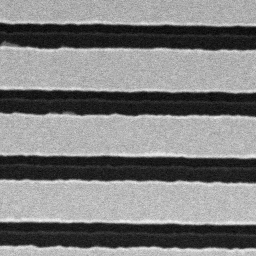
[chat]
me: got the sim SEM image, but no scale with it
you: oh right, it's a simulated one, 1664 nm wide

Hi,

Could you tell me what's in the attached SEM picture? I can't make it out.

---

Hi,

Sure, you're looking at lines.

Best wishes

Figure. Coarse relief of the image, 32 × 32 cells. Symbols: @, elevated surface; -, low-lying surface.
@@@@@@@@@@@@@@@@@@@@@@@@@@@@@@@@
@@@@@@@@@@@@@@@@@@@@@@@@@@@@@@@@
@@@@@@@@@@@@@@@@@@@@@@@@@@@@@@@@
--------------------------------
--------------------------------
--------------------------------
@@@@@@@@@@@@@@@@@@@@@@@@@@@@@@@@
@@@@@@@@@@@@@@@@@@@@@@@@@@@@@@@@
@@@@@@@@@@@@@@@@@@@@@@@@@@@@@@@@
@@@@@@@@@@@@@@@@@@@@@@@@@@@@@@@@
@@@@@@@@@@@@@@@@@@@@@@@@@@@@@@@@
----------------@----@@@@@--@@@@
--------------------------------
--------------------------------
@@@@@@@@@@@@@@@@-@@@@@-@@@-@@@--
@@@@@@@@@@@@@@@@@@@@@@@@@@@@@@@@
@@@@@@@@@@@@@@@@@@@@@@@@@@@@@@@@
@@@@@@@@@@@@@@@@@@@@@@@@@@@@@@@@
@@@@@@@@@@@@@@@@@@@@@@@@@@@@@@@@
---------------@@@@@@@@@@@@@@@@@
--------------------------------
--------------------------------
--------------------------------
@@@@@@@@@@@@@@@@@@@@@@@@@@@@@@@@
@@@@@@@@@@@@@@@@@@@@@@@@@@@@@@@@
@@@@@@@@@@@@@@@@@@@@@@@@@@@@@@@@
@@@@@@@@@@@@@@@@@@@@@@@@@@@@@@@@
@@@@@@@@@@@@@@@@@@@@@@@@@@@@@@@@
--------------------------------
--------------------------------
--------------------------------
@@@@@@@@@@@@@@@@@@@@@@@@@@@@@@@@